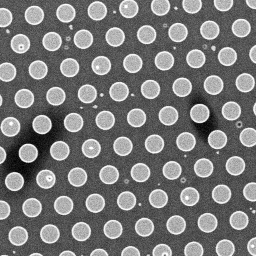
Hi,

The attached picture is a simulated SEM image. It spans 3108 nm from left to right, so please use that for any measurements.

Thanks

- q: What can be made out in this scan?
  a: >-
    an array of small figures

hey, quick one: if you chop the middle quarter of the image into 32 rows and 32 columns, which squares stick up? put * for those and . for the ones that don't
****...*****...****....****.....
****...****.....***.............
***.....**......................
................................
....................***.....***.
.....**.....****...*****...*****
....****....****....****...*****
....****...*****....****....***.
....****....***......*..........
.....**.........................
................................
.................**.....****....
..*......***....****....****....
****....*****...****....****....
*****...*****...****....****....
*****....***.....**.............
.***............................
.............................***
..............**.....***....****
.....***.....****...*****...****
*....****....****...*****...****
*....****....****....***......**
*....****.....**................
................................
................................
...........*.....****....****...
..***....****....****....****...
.****....*****...****....****...
.*****...****....****.....**....
.****.....***...................
................................
..............................**